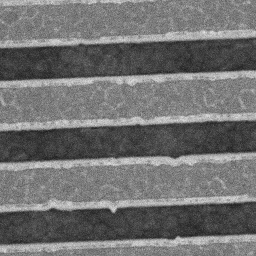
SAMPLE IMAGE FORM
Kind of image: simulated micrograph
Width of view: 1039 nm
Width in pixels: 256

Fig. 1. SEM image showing one or a few lines or trenches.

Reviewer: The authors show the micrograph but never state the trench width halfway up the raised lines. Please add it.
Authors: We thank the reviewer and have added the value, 150 nm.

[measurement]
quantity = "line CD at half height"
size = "45.4 px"